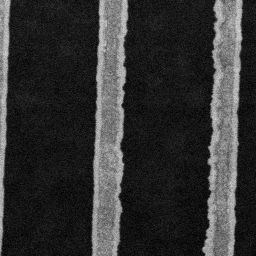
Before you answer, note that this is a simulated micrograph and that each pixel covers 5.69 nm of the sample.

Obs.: one or a few lines or trenches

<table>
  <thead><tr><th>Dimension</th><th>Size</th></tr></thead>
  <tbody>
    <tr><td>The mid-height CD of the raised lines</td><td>22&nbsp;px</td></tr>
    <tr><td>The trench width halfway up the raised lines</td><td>538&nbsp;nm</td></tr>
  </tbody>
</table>